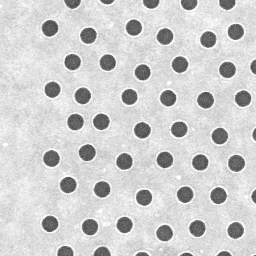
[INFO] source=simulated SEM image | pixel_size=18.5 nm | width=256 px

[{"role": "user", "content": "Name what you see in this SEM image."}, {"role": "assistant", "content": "a regular array of holes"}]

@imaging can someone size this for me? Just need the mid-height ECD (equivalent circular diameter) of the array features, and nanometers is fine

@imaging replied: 323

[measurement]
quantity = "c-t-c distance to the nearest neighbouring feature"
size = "605 nm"